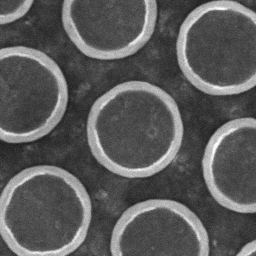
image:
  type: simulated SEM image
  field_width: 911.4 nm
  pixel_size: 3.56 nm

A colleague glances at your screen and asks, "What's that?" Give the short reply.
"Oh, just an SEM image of raised bodies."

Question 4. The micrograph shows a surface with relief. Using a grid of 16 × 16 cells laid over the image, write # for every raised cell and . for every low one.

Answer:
##..#####....##.
....#####...####
.....####..#####
##.........#####
####........####
####....#....##.
####..#####.....
###...#####.....
##....#####...##
......#####..###
.......###...###
.####........###
#####.........##
#####...####....
#####..######...
.###...######...